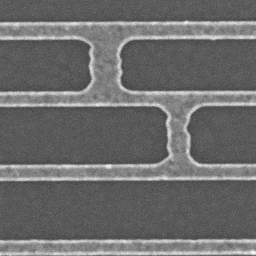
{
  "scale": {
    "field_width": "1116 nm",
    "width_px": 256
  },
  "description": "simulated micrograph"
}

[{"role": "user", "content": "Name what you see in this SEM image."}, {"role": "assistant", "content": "one or a few lines or trenches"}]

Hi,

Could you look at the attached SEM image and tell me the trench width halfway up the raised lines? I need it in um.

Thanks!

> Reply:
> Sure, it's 0.262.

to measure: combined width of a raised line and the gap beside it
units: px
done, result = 72.1